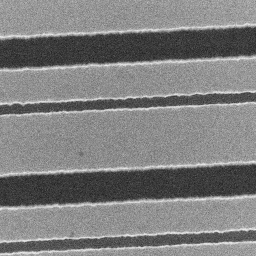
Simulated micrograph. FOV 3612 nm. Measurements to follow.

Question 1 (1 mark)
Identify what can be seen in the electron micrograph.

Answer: lines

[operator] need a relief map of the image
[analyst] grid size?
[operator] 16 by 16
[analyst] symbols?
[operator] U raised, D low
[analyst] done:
UUUUUUUUUUUUUUUU
UUUUUUUUUUUUUUUU
DDDDDDDDDDDDDDDD
DDDDDDDDDDDDDDDD
UUUUUUUUUUUUUUUU
UUUUUUUUUUUUUUUU
UUUUUUUUUUUUUUUU
UUUUUUUUUUUUUUUU
UUUUUUUUUUUUUUUU
UUUUUUUUUUUUUUUU
UUUUUUUUUDDDDDDD
DDDDDDDDDDDDDDDD
DDDDDDDDDDDDUUUU
UUUUUUUUUUUUUUUU
UUUUUUUUUUUUUUUU
UUUUUUUUUUUUUUUU